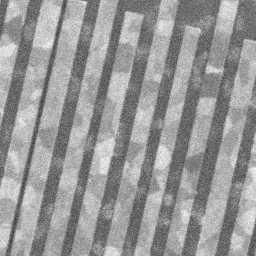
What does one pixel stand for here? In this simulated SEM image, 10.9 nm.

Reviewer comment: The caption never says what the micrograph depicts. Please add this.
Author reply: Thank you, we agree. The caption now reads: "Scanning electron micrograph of parallel lines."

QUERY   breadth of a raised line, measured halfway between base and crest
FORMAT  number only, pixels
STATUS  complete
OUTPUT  16.6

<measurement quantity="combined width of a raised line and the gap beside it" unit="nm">322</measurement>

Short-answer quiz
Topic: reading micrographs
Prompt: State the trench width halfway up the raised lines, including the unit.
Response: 162 nanometres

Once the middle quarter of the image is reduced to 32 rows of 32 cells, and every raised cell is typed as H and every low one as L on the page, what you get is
HHLLLLHHHHLLLHHHHLLLLHHHHLLLHHHH
HHLLLHHHHLLLHHHHHLLLLHHHHLLLHHHH
HLLLLHHHHLLLHHHHLLLLHHHHHLLLHHHL
HLLLLHHHHLLLHHHHLLLLHHHHLLLLHHHL
HLLLLHHHHLLLHHHHLLLLHHHHLLLHHHHL
HLLLLHHHHLLHHHHHLLLLHHHHLLLHHHHL
LLLLHHHHLLLHHHHLLLLLHHHHLLLHHHLL
LLLLHHHHLLLHHHHLLLLHHHHLLLLHHHLL
LLLLHHHHLLLHHHHLLLLHHHHLLLLHHHLL
LLLLHHHHLLLHHHHLLLLHHHHLLLHHHHLL
LLLHHHHLLLHHHHHLLLLHHHHLLLHHHHLL
LLLHHHHLLLHHHHLLLLHHHHLLLLHHHLLL
LLLHHHHLLLHHHHLLLLHHHHLLLLHHHLLL
LLLHHHHLLLHHHHLLLLHHHHLLLHHHHLLL
LLLHHHHLLLHHHHLLLLHHHHLLLHHHHLLL
LLHHHHLLLHHHHLLLLLHHHHLLLHHHLLLL
LLHHHHLLLHHHHLLLLHHHHLLLLHHHLLLL
LLHHHHLLLHHHHLLLLHHHHLLLLHHHLLLL
LLHHHHLLLHHHHLLLLHHHHLLLHHHHLLLL
LHHHHLLLHHHHHLLLLHHHHLLLHHHHLLLH
LHHHHLLLHHHHLLLLHHHHLLLLHHHLLLLH
LHHHHLLLHHHHLLLLHHHHLLLLHHHLLLLH
LHHHHLLLHHHHLLLLHHHHLLLHHHHLLLLH
LHHHLLLHHHHHLLLLHHHHLLLHHHHLLLLH
HHHHLLLHHHHLLLLLHHHLLLLHHHLLLLHH
HHHHLLLHHHHLLLLHHHHLLLLHHHLLLLHH
HHHHLLLHHHHLLLLHHHHLLLHHHHLLLLHH
HHHHLLLHHHHLLLLHHHHLLLHHHHLLLLHH
HHHLLLHHHHHLLLLHHHHLLLHHHHLLLHHH
HHHLLLHHHHLLLLHHHHLLLLHHHLLLLHHH
HHHLLLHHHHLLLLHHHHLLLLHHHLLLLHHH
HHHLLLHHHHLLLLHHHHLLLHHHHLLLLHHH